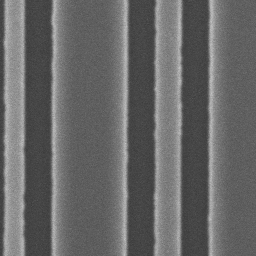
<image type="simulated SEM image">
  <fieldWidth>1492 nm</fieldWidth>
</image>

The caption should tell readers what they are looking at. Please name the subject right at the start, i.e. lines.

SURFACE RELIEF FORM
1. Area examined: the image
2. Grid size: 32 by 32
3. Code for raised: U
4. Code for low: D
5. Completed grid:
DUUDDDDUUUUUUUUUDDDDUUUDDDUUUUUU
DUUDDDDUUUUUUUUUDDDDUUUDDDUUUUUU
DUUDDDDUUUUUUUUUDDDDUUUDDDUUUUUU
DUUDDDDUUUUUUUUUDDDDUUUDDDUUUUUU
DUUDDDDUUUUUUUUUDDDDUUUDDDUUUUUU
DUUDDDDUUUUUUUUUDDDDUUUDDDUUUUUU
DUUDDDDUUUUUUUUUDDDDUUDDDDUUUUUU
DUUDDDDUUUUUUUUUDDDUUUUDDDUUUUUU
DUUDDDDUUUUUUUUUDDDDUUUDDDUUUUUU
DUUDDDDUUUUUUUUUDDDDUUUDDDUUUUUU
DUUDDDDUUUUUUUUUDDDDUUUDDDUUUUUU
DUUDDDDUUUUUUUUUDDDUUUDDDDUUUUUU
DUUDDDDUUUUUUUUUDDDDUUDDDDUUUUUU
DUUDDDDUUUUUUUUUDDDDUUUDDDUUUUUU
DUUDDDDUUUUUUUUUDDDUUUUDDDUUUUUU
DUUDDDDUUUUUUUUUDDDDUUUDDDUUUUUU
DUUDDDDUUUUUUUUUDDDUUUUDDDUUUUUU
DUUDDDDUUUUUUUUUDDDUUUDDDDUUUUUU
DUUDDDDUUUUUUUUUDDDDUUDDDDUUUUUU
DUUDDDDUUUUUUUUUDDDDUUDDDDUUUUUU
DUUDDDDUUUUUUUUUDDDDUUDDDDUUUUUU
DUUDDDDUUUUUUUUUDDDDUUDDDDUUUUUU
DUUDDDDUUUUUUUUUDDDDUUDDDDUUUUUU
DUUDDDDUUUUUUUUUDDDDUUDDDDUUUUUU
DUUDDDDUUUUUUUUUDDDUUUDDDDUUUUUU
DUUDDDDUUUUUUUUUDDDUUUDDDDUUUUUU
DUUDDDDUUUUUUUUUDDDUUUDDDDUUUUUU
DUUDDDDUUUUUUUUUDDDUUUDDDDUUUUUU
DUUDDDDUUUUUUUUUDDDUUUDDDDUUUUUU
DUUDDDDUUUUUUUUUDDDUUUDDDDUUUUUU
DUUDDDDUUUUUUUUUDDDUUUDDDDUUUUUU
DUUDDDDUUUUUUUUUDDDUUUDDDDUUUUUU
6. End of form